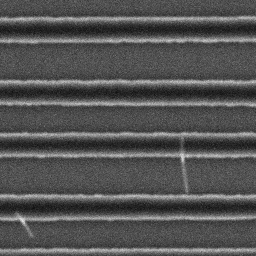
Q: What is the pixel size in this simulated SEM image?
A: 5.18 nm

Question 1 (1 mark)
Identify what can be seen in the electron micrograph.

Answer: lines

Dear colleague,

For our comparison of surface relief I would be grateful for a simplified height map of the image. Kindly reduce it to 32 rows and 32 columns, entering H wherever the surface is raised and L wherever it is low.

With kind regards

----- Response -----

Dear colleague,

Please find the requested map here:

LLLLLLLLLLLLLLLLLLLLLLLLLLLLLLLL
LLLLLLLLLLLLLLLLLLLLLLLLLLLLLLLL
HHHHHHHHHHHHHHHHHHHHHHHHHHHHHHHH
HHHHHHHHHHHHHHHHHHHHHHHHHHHHHHHH
HHHHHHHHHHHHHHHHHHHHHHHHHHHHHHHH
LLLLLLLLLLLLLLLLLLLLLLLLLLLLLLLL
LLLLLLLLLLLLLLLLLLLLLLLLLLLLLLLL
LLLLLLLLLLLLLLLLLLLLLLLLLLLLLLLL
LLLLLLLLLLLLLLLLLLLLLLLLLLLLLLLL
LLLLLLLLLLLLLLLLLLLLLLLLLLLLLLLL
HHHHHHHHHHHHHHHHHHHHHHHHHHHHHHHH
HHHHHHHHHHHHHHHHHHHHHHHHHHHHHHHH
HHHHHHHHHHHHHHHHHHHHHHHHHHHHHHHH
LLLLLLLLLLLLLLLLLLLLLLLLLLLLLLLL
LLLLLLLLLLLLLLLLLLLLLLLLLLLLLLLL
LLLLLLLLLLLLLLLLLLLLLLLLLLLLLLLL
LLLLLLLLLLLLLLLLLLLLLLLLLLLLLLLL
HHHHHHHHHHHHHHHHHHHHHHHHHHHHHHHH
HHHHHHHHHHHHHHHHHHHHHHHHHHHHHHHH
HLLLHHLLLLLLLLLHLLLLLLHHHHHHHHLL
LLLLLLLLLLLLLLLLLLLLLLLLLLLLLLLL
LLLLLLLLLLLLLLLLLLLLLLLLLLLLLLLL
LLLLLLLLLLLLLLLLLLLLLLLLLLLLLLLL
LLLLLLLLLLLLLLLLLLLLLLLLLLLLLLLL
HHLHHHHHHHHHHLLHHHHHLLLLLHHHLLLH
HHHHHHHHHHHHHHHHHHHHHHHHHHHHHHHH
HHHHHHHHHHHHHHHHHHHHHHHHHHHHHHHH
LLHHLLLLLLLLLLLLLLLLLLLLLLLLLLLL
LLLLLLLLLLLLLLLLLLLLLLLLLLLLLLLL
LLLLLLLLLLLLLLLLLLLLLLLLLLLLLLLL
LLLLLLLLLLLLLLLLLLLLLLLLLLLLLLLL
HHHHHHHHHHHHHHHHHHHHHHHHHHHHHHHH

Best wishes